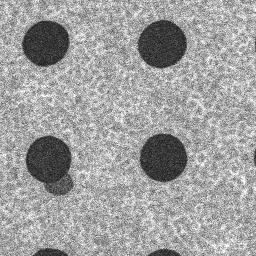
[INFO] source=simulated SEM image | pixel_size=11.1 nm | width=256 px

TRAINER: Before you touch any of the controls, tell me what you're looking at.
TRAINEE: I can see holes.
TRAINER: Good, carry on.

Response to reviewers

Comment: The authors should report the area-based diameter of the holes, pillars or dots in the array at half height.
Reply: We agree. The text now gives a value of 539 nm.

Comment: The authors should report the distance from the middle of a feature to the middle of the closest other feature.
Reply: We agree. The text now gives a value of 113 pixels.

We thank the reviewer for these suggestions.